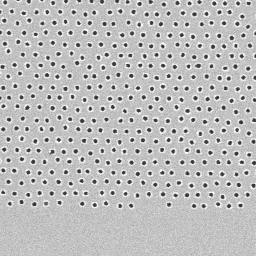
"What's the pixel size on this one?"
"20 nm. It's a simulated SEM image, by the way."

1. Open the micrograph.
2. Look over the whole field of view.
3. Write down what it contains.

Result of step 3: a regular array of holes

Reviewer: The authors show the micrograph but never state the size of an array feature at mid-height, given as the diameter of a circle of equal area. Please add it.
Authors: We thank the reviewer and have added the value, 90.3 nm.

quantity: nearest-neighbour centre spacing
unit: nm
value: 208